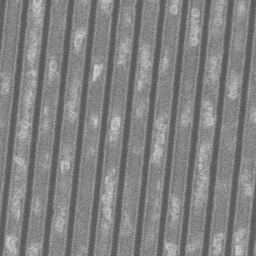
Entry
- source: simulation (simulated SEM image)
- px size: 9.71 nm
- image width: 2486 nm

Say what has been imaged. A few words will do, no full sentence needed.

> parallel lines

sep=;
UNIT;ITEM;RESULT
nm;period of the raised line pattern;220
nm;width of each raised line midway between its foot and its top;90.6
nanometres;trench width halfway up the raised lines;132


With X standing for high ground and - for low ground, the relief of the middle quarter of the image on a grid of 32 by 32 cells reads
X----XX----XX---XX----XX----XX--
X----XXXX-XXX---XX----XX---XXX--
X----XXX--XX----XX----XX---XXX--
X---XXX---XX----XX----XX---XXX--
X---XX----XX----XX----XX---XX---
X---XX----XX----XX---XX----XX---
X---XX----XX----XX---XX----XX---
X---XX----XX----XX---XX----XX---
----XX----XX---XXX---XX----XX---
----XX----XX---XX----XX----XX---
----XX---XXX---XX----XX----XX---
----XX---XXX---XX----XX----XX---
----XX---XX----XX----XX---XX----
---XXX---XX----XX----XX---XX----
---XX----XX--X-XX----XX---XX----
---XX----XX-X--XX---XXX---XX----
---XX----XX----XX---XXX---XX----
---XX----XX----XX---XX----XX---X
---XX---XXX---XXX---XX----XX---X
---XX---XXX---XX----XX----XX---X
---XX---XX----XX----XX----XX---X
---XX---XX----XX----XX----XX---X
---XX---XX----XX----XX---XX----X
--XXX---XX----XX----XX---XX----X
--XX----XX----XX----XX---XX----X
X-XX----XX----XX---XXX---XX----X
--XX----XX----XX---XX----XX----X
--XX----XX---XXX---XX----XX---XX
--XX----XX---XXX---XX----XX---XX
--XX----XX---XX----XX----XX---XX
--XX---XXX---XX----XX---XXX---XX
--XX---XX--X-XX----XX---XX----XX